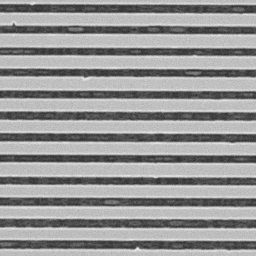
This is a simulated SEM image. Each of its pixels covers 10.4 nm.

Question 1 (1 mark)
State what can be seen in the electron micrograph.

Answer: parallel lines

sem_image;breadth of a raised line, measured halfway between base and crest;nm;127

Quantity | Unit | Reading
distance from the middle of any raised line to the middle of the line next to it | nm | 223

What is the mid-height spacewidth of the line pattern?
0.0906 µm